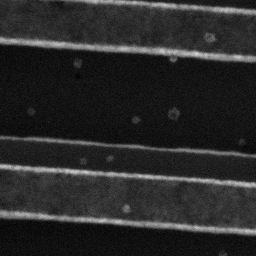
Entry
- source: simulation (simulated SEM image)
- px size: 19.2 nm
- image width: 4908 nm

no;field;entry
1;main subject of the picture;lines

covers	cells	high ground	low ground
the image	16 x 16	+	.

++++++++++++++..
++++++++++++++++
++++++++++++++++
............++++
................
................
................
................
................
................
+++.............
++++++++++++++++
++++++++++++++++
.+++++++++++++++
...............+
................